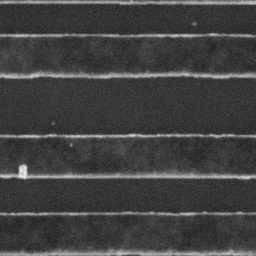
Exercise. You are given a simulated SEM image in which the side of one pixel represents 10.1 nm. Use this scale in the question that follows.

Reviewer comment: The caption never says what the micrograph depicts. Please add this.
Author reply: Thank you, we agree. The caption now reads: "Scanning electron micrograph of lines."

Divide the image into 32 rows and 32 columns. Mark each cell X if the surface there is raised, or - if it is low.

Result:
--------------------------------
--------------------------------
--------------------------------
--------------------------------
XXXXXXXXXXXXXX---XXXXXXXXXXXXXX-
XXXXXXXXXXXXXXXXXXXXXXXXXXXXXXXX
XXXXXXXXXXXXXXXXXXXXXXXXXXXXXXXX
XXXXXXXXXXXXXXXXXXXXXXXXXXXXXXXX
XXXXXXXXXXXXXXXXXXXXXXXXXXXXXXXX
-XXX-------XXX------------XXX---
--------------------------------
--------------------------------
--------------------------------
--------------------------------
--------------------------------
--------------------------------
--------------------------------
XXXXXXXXXXXXXXXXXXXXXXXXXXXXXXXX
XXXXXXXXXXXXXXXXXXXXXXXXXXXXXXXX
XXXXXXXXXXXXXXXXXXXXXXXXXXXXXXXX
XXXXXXXXXXXXXXXXXXXXXXXXXXXXXXXX
XXXXXXXXXXXXXXXXXXXXXXXXXXXXXXXX
--------------------------------
--------------------------------
--------------------------------
--------------------------------
--------------------------------
XXXXXXXXXXXXXXXXXXXXXXXXXXXXXXXX
XXXXXXXXXXXXXXXXXXXXXXXXXXXXXXXX
XXXXXXXXXXXXXXXXXXXXXXXXXXXXXXXX
XXXXXXXXXXXXXXXXXXXXXXXXXXXXXXXX
XXXXXXXXXXXXXXXXXXXXXXXXXXXXXXXX